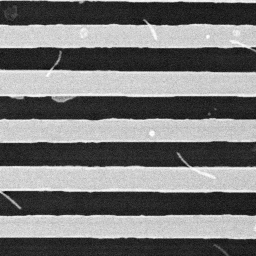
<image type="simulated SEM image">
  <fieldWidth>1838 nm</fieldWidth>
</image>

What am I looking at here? lines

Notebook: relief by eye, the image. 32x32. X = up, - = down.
--------------------------------
--------------------------------
--------------------------------
XXXXXXXXXXXXXXXXXXXXXXXXXXXXXXXX
XXXXXXXXXXXXXXXXXXXXXXXXXXXXXXXX
XXXXXXXXXXXXXXXXXXXXXXXXXXXXXXXX
--------------------------------
--------------------------------
--------------------------------
XXXXXXXXXXXXXXXXXXXXXXXXXXXXXXXX
XXXXXXXXXXXXXXXXXXXXXXXXXXXXXXXX
XXXXXXXXXXXXXXXXXXXXXXXXXXXXXXXX
--------------------------------
--------------------------------
--------------------------------
XXXXXXXXXXXXXXXXXXXXXXXXXXXXXXXX
XXXXXXXXXXXXXXXXXXXXXXXXXXXXXXXX
XXXXXXXXXXXXXXXXXXXXXXXXXXXXXXXX
--------------------------------
--------------------------------
--------------------------------
XXXXXXXXXXXXXXXXXXXXXXXXXXXXXXXX
XXXXXXXXXXXXXXXXXXXXXXXXXXXXXXXX
XXXXXXXXXXXXXXXXXXXXXXXXXXXXXXXX
--------------------------------
--------------------------------
--------------------------------
XXXXXXXXXXXXXXXXXXXXXXXXXXXXXXXX
XXXXXXXXXXXXXXXXXXXXXXXXXXXXXXXX
XXXXXXXXXXXXXXXXXXXXXXXXXXXXXXXX
--------------------------------
--------------------------------